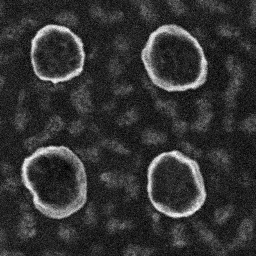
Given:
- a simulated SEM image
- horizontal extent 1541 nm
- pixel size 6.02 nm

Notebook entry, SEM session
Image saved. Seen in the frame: raised bodies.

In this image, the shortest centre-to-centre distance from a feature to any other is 717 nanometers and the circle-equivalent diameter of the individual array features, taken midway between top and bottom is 354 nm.